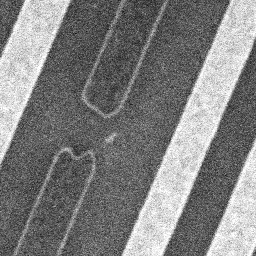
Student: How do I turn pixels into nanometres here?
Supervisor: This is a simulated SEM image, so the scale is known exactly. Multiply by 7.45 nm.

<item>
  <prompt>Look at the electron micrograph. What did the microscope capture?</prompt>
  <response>one or a few lines or trenches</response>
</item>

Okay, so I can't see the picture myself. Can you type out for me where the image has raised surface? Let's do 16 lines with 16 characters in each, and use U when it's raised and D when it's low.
DUUUDDDUUUDDDDUU
DUUUDDDUUUDDDDUU
DUUDDDDUUDDDDUUU
UUUDDDUUUDDDDUUD
UUDDDDUUDDDDDUUD
UUDDDUUUDDDDUUUD
UUDDDDUUDDDDUUDD
UDDDDDDDDDDUUUDD
UDDDDDDDDDDUUDDD
DDDDDDDDDDUUUDDD
DDDUUUDDDDUUDDDU
DDDUUUDDDDUUDDDU
DDUUUDDDDUUUDDUU
DDUUUDDDDUUDDDUU
DDUUDDDDUUUDDDUU
DUUUDDDDUUDDDUUU